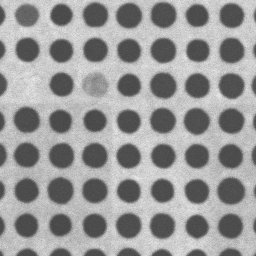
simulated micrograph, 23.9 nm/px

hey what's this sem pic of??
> a regular array of holes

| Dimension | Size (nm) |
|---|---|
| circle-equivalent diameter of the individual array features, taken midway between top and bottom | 591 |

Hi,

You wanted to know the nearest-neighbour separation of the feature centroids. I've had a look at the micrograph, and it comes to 809 nanometres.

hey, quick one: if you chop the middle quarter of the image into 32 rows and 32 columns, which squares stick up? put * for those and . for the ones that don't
********************************
********************************
.***************.******...******
..************.....***.....****.
..************.....***......**..
..*****.*****......**.......**..
..****...*****.....***......**..
.******..*****....****.....****.
************************..******
********************************
********************************
*******.*******..******....****.
.****.....****.....***.....***..
..***.....***......***......**..
..***......**......**.......**..
..***.....****.....***......**..
.*****....****....****.....****.
****************.***************
********************************
********************************
.*****....****....*****....****.
..***......***.....***......**..
...*.......**......***......**..
...*.......**......***......**..
..***......***.....***......**..
.*****....****....*****....****.
********************************
********************************
*******.************************
..***.....****....*****....****.
..***......**......***.....***..
...*.......**......***......**..